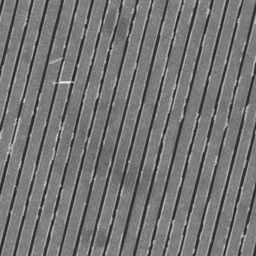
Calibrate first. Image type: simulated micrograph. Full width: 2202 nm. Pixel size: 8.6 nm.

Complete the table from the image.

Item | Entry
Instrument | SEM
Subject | parallel lines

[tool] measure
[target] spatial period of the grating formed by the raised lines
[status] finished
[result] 125 nm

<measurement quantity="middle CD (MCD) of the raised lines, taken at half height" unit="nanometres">97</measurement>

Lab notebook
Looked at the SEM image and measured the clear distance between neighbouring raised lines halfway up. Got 29.2 nanometres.